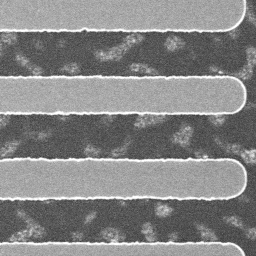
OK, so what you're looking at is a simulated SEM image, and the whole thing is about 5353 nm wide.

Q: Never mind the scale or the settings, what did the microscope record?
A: one or a few lines or trenches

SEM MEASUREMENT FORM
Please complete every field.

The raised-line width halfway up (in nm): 794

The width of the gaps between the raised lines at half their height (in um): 0.951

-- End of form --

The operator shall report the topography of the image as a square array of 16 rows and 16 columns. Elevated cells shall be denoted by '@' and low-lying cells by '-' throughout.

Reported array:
@@@@@@@@@@@@@@@-
@@@@@@@@@@@@@@@-
----------------
----------------
----------------
@@@@@@@@@@@@@@@-
@@@@@@@@@@@@@@@-
----------------
----------------
----------------
@@@@@@@@@@@@@@@-
@@@@@@@@@@@@@@@-
----------------
----------------
----------------
@@@@@@@@@@@@@@@-